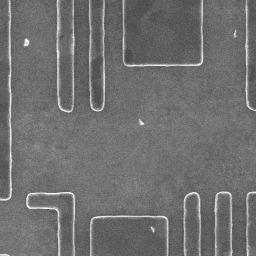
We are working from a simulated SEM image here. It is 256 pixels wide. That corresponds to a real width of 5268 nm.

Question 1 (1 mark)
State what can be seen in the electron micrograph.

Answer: wiring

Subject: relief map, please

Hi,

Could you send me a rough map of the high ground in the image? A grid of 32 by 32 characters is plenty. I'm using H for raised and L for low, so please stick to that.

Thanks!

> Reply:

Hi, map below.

HLLLLLLHHLLHHLLHHHHHHHHHHLLLLLLH
HLLLLLLHHLLHHLLHHHHHHHHHHLLLLLLH
HLLLLLLHHLLHHLLHHHHHHHHHHLLLLLLH
HLLLLLLHHLLHHLLHHHHHHHHHHLLLLLLH
HLLLLLLHHLLHHLLHHHHHHHHHHLLLLLLH
HLLLLLLHHLLHHLLHHHHHHHHHHLLLLLLH
HLLLLLLHHLLHHLLHHHHHHHHHHLLLLLLH
HLLLLLLHHLLHHLLHHHHHHHHHHLLLLLLH
HLLLLLLHHLLHHLLLLLLLLLLLLLLLLLLH
HLLLLLLHHLLHHLLLLLLLLLLLLLLLLLLH
HLLLLLLHHLLHHLLLLLLLLLLLLLLLLLLH
HLLLLLLHHLLHHLLLLLLLLLLLLLLLLLLH
HLLLLLLHHLLHHLLLLLLLLLLLLLLLLLLH
HLLLLLLLHLLLHLLLLLLLLLLLLLLLLLLH
HLLLLLLLLLLLLLLLLLLLLLLLLLLLLLLL
HLLLLLLLLLLLLLLLLLLLLLLLLLLLLLLL
HLLLLLLLLLLLLLLLLLLLLLLLLLLLLLLL
HLLLLLLLLLLLLLLLLLLLLLLLLLLLLLLL
HLLLLLLLLLLLLLLLLLLLLLLLLLLLLLLL
HLLLLLLLLLLLLLLLLLLLLLLLLLLLLLLL
HLLLLLLLLLLLLLLLLLLLLLLLLLLLLLLL
HLLLLLLLLLLLLLLLLLLLLLLLLLLLLLLL
HLLLLLLLLLLLLLLLLLLLLLLLLLLLLLLL
HLLLLLLLLLLLLLLLLLLLLLLLLLLLLLLL
HLLLHHHHHLLLLLLLLLLLLLLHHLLHHLLH
LLLHHHHHHLLLLLLLLLLLLLLHHLLHHLLH
LLLLLLLHHLLLLLLLLLLLLLLHHLLHHLLH
LLLLLLLHHLLHHHHHHHHHHLLHHLLHHLLH
LLLLLLLHHLLHHHHHHHHHHLLHHLLHHLLH
LLLLLLLHHLLHHHHHHHHHHLLHHLLHHLLH
LLLLLLLHHLLHHHHHHHHHHLLHHLLHHLLH
LLLLLLLHHLLHHHHHHHHHHLLHHLLHHLLH